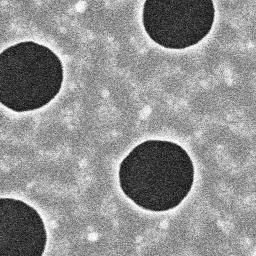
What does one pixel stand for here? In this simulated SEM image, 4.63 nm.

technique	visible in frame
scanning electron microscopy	holes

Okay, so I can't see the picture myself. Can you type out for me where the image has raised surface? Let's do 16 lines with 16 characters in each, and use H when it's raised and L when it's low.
HHHHHHHHHLLLLHHH
HHHHHHHHHLLLLHHH
HHHHHHHHHHLLLHHH
LLLLHHHHHHHHHHHH
LLLLHHHHHHHHHHHH
LLLLHHHHHHHHHHHH
LLLHHHHHHHHHHHHH
HHHHHHHHHHHHHHHH
HHHHHHHHHHHHHHHH
HHHHHHHHLLLLHHHH
HHHHHHHLLLLLHHHH
HHHHHHHLLLLLHHHH
LHHHHHHHLLLHHHHH
LLHHHHHHHHHHHHHH
LLLHHHHHHHHHHHHH
LLLHHHHHHHHHHHHH